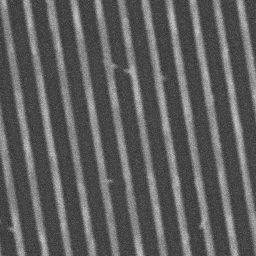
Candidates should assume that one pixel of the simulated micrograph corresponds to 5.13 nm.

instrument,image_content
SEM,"parallel lines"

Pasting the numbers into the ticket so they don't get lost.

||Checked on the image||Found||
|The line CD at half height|30.3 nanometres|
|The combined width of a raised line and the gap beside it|120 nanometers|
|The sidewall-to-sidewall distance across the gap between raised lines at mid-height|91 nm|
